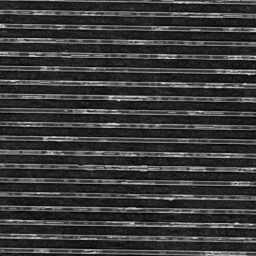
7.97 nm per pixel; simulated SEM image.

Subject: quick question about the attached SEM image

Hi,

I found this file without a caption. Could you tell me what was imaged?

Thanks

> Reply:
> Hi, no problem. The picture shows parallel lines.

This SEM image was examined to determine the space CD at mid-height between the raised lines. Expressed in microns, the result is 0.0807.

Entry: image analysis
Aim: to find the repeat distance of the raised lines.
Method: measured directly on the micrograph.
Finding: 14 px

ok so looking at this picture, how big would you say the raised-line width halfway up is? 33.9 nm